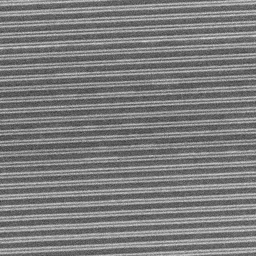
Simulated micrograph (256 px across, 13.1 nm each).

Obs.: parallel lines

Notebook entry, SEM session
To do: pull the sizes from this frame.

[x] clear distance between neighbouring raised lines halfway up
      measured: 93.2 nm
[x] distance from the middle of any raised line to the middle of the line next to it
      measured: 141 nm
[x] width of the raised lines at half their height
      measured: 47.4 nanometres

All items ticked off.